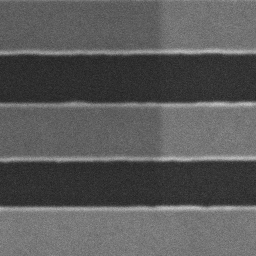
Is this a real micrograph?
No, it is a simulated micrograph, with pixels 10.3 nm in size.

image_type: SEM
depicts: lines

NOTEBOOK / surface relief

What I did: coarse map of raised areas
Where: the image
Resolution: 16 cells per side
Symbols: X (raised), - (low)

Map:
XXXXXXXXXXXXXXXX
XXXXXXXXXXXXXXXX
XXXXXXXXXXXXXXXX
----------------
----------------
----------------
----X---X---XXXX
XXXXXXXXXXXXXXXX
XXXXXXXXXXXXXXXX
XXXXXXXXXXXXXXXX
----------------
----------------
----------------
XXXXXXXXXXXXXXXX
XXXXXXXXXXXXXXXX
XXXXXXXXXXXXXXXX